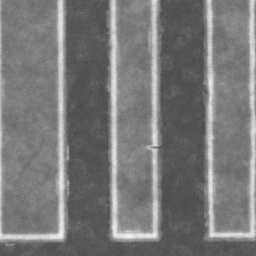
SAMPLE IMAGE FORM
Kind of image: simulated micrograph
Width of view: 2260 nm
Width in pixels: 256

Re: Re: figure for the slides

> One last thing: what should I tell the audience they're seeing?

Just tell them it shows one or a few lines or trenches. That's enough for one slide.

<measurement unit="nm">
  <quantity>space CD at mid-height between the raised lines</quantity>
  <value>479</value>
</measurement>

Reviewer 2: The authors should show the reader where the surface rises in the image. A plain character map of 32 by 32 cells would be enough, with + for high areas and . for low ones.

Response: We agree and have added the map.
++++++++......+++++.......+++++.
++++++++......+++++.......+++++.
++++++++......+++++.......+++++.
++++++++......+++++.......+++++.
++++++++......+++++.......+++++.
++++++++......+++++.......+++++.
++++++++......+++++.......++++++
++++++++......+++++.......++++++
++++++++......+++++.......++++++
++++++++......+++++.......++++++
++++++++......+++++.......++++++
++++++++......+++++.......++++++
++++++++......+++++.......++++++
++++++++......+++++.......++++++
++++++++......+++++.......++++++
++++++++......+++++.......++++++
++++++++......+++++.......++++++
++++++++......+++++.......++++++
++++++++......+++++.......++++++
++++++++......+++++.......++++++
++++++++......+++++.......++++++
++++++++......+++++.......++++++
++++++++......+++++.......++++++
++++++++......+++++.......+++++.
++++++++......+++++.......+++++.
++++++++......+++++.......+++++.
++++++++......+++++.......++++++
++++++++......+++++.......++++++
++++++++......+++++.......+++++.
+++++++.........++..............
................................
................................